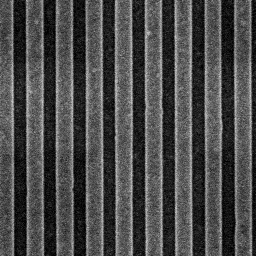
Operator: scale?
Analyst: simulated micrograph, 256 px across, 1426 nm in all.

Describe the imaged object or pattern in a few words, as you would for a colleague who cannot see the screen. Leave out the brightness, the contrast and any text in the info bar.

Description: parallel lines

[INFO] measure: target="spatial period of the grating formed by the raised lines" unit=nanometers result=166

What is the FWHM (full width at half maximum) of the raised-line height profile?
94.7 nm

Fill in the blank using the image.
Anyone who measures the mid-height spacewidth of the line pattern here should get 70.3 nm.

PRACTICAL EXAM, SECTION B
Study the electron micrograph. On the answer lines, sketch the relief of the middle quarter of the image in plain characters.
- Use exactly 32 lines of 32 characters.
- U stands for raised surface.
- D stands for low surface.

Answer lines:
UUDDDDUUUUDDDUUUUDDDUUUUDDDDUUUU
UUDDDDUUUUDDDUUUUDDDUUUUDDDDUUUU
UUDDDDUUUUDDDUUUUDDDUUUUDDDDUUUU
UUDDDDUUUUDDDUUUUDDDUUUUDDDDUUUU
UUDDDDUUUUDDDUUUUDDDUUUUDDDDUUUU
UUDDDDUUUUDDDUUUUDDDUUUUDDDDUUUU
UUDDDDUUUUDDDUUUUDDDUUUUDDDDUUUU
UUDDDDUUUUDDDUUUUDDDUUUUDDDDUUUU
UUDDDDUUUUDDDUUUUDDDUUUUDDDDUUUU
UUDDDDUUUUDDDUUUUDDDUUUUDDDDUUUU
UUDDDDUUUUDDDUUUUDDDDUUUDDDDUUUU
UUDDDDUUUUDDDUUUUDDDDUUUUDDDUUUU
UUDDDDUUUUDDDUUUUDDDUUUUUDDDUUUU
UUDDDDUUUUDDDUUUUDDDUUUUDDDDUUUU
UUDDDDUUUUDDDUUUUDDDUUUUDDDDUUUU
UUDDDDUUUUDDDUUUUDDDUUUUDDDDUUUU
UUDDDDUUUUDDDUUUUDDDUUUUDDDDUUUU
UUDDDDUUUUDDDUUUUDDDUUUUDDDDUUUU
UUDDDDUUUUDDDUUUUDDDUUUUDDDDUUUU
UUDDDDUUUUDDDUUUUDDDUUUUDDDDUUUU
UUDDDDUUUUDDDUUUUDDDUUUUDDDDUUUU
UUDDDDUUUUDDDUUUUDDDUUUUDDDDUUUU
UUDDDDUUUUDDDUUUUDDDUUUUDDDDUUUU
UUDDDDUUUUDDDUUUUDDDUUUUDDDDUUUU
UUDDDDUUUUDDDUUUUDDDUUUUDDDDUUUU
UUDDDDUUUUDDDUUUUDDDUUUUDDDDUUUU
UUDDDDUUUUDDDUUUUDDDUUUUDDDDUUUU
UUDDDDUUUUDDDUUUUDDDUUUUDDDDUUUU
UUDDDDUUUUDDDUUUUDDDUUUUDDDDUUUU
UUDDDDUUUUDDDUUUUDDDUUUUDDDDUUUU
UUDDDDUUUUDDDUUUUDDDUUUUDDDDUUUU
UUDDDDUUUUDDDUUUUDDDUUUUDDDDUUUU